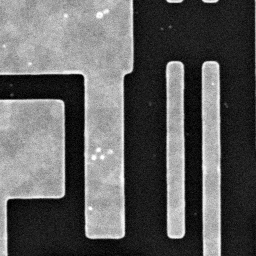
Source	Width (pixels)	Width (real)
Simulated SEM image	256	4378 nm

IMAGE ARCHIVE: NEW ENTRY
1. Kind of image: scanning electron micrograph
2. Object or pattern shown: wiring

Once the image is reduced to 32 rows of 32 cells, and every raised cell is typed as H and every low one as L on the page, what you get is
HHHHHHHHHHHHHHHHLLLLLLLLLLLLLLLL
HHHHHHHHHHHHHHHHHLLLLLLLLLLLLLLL
HHHHHHHHHHHHHHHHHLLLLLLLLLLLLLLL
HHHHHHHHHHHHHHHHHLLLLLLLLLLLLLLL
HHHHHHHHHHHHHHHHHLLLLLLLLLLLLLLL
HHHHHHHHHHHHHHHHHLLLLLLLLLLLLLLL
HHHHHHHHHHHHHHHHHLLLLLLLLLLLLLLL
HHHHHHHHHHHHHHHHHLLLLLLLLLLLLLLL
HHHHHHHHHHHHHHHHHLLLLHHLLHHLLLLL
LLLLLLLLLLHHHHHHLLLLLHHLLHHLLLLL
LLLLLLLLLLLHHHHLLLLLLHHLLHHLLLLL
LLLLLLLLLLLHHHHLLLLLLHHLLHHLLLLL
LLLLLLLLLLLHHHHLLLLLLHHLLHHLLLLL
HHHHHHHHLLLHHHHLLLLLLHHLLHHLLLLL
HHHHHHHHLLLHHHHLLLLLLHHLLHHLLLLL
HHHHHHHHLLLHHHHLLLLLLHHLLHHLLLLL
HHHHHHHHLLLHHHHLLLLLLHHLLHHLLLLL
HHHHHHHHLLLHHHHLLLLLLHHLLHHLLLLL
HHHHHHHHLLLHHHHLLLLLLHHLLHHLLLLL
HHHHHHHHLLLHHHHLLLLLLHHLLHHLLLLL
HHHHHHHHLLLHHHHLLLLLLHHLLHHLLLLL
HHHHHHHHLLLHHHHLLLLLLHHLLHHLLLLL
HHHHHHHHLLLHHHHLLLLLLHHLLHHLLLLL
HHHHHHHHLLLHHHHLLLLLLHHLLHHLLLLL
HHHHHHHHLLLHHHHLLLLLLHHLLHHLLLLL
HLLLLLLLLLLHHHHLLLLLLHHLLHHLLLLL
HLLLLLLLLLLHHHHLLLLLLHHLLHHLLLLL
HLLLLLLLLLLHHHHLLLLLLHHLLHHLLLLL
HLLLLLLLLLLHHHHLLLLLLHHLLHHLLLLL
HLLLLLLLLLLHHHHLLLLLLHHLLHHLLLLL
HLLLLLLLLLLLLLLLLLLLLLLLLHHLLLLL
HLLLLLLLLLLLLLLLLLLLLLLLLHHLLLLL